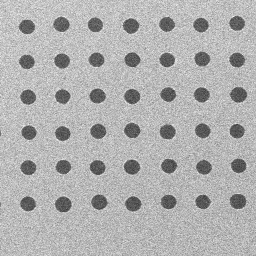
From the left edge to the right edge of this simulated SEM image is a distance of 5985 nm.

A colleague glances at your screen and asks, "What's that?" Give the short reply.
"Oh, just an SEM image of a regular array of holes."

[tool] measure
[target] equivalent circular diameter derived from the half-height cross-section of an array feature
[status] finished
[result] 0.37 um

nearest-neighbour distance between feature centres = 804 nanometers